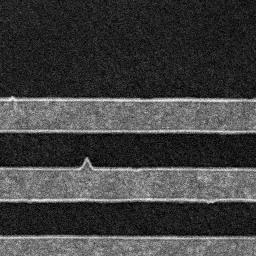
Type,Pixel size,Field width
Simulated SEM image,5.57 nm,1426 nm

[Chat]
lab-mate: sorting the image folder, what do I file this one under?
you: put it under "one or a few lines or trenches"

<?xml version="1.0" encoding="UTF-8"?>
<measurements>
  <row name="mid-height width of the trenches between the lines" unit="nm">209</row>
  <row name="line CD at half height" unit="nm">173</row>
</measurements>